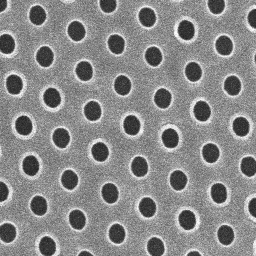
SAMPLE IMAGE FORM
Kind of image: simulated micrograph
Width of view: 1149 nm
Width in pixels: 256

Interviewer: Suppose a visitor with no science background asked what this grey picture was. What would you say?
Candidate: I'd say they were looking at a regular array of holes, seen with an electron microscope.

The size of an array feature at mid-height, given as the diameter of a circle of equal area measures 19.5 pixels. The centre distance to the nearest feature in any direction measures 181 nanometres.